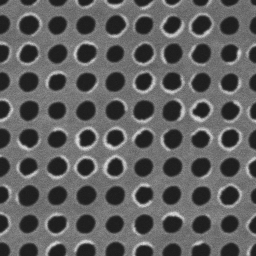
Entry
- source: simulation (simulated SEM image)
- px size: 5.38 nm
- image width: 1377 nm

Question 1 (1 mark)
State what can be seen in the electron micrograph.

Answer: a regular array of holes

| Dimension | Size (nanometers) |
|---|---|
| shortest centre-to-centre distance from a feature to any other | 151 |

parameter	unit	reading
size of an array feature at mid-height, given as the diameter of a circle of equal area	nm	99.4